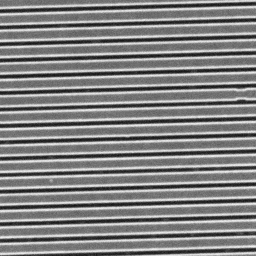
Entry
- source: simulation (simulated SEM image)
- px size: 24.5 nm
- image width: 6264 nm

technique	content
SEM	parallel lines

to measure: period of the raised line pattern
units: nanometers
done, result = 401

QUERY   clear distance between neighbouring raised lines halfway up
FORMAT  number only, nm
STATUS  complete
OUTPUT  153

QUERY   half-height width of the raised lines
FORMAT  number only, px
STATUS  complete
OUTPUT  10.7